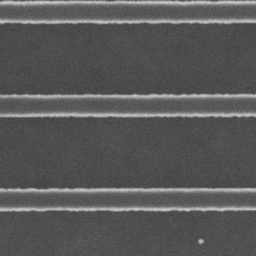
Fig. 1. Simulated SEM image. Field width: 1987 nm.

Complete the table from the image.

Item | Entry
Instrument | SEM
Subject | lines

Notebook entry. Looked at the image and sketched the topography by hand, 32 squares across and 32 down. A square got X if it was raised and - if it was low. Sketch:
XXXXXXXXXXXXXXXXXXXXXXXXXXXXXXXX
XXXXXXXXXXXXXXXXXXXXXXXXXXXXXXXX
XXXXXXXXXXXXXXXXXXXXXXXXXXXXXXXX
--------------------------------
--------------------------------
--------------------------------
--------------------------------
--------------------------------
--------------------------------
--------------------------------
--------------------------------
--------------------------------
XXXXXXXXXXXXXXXXXXXXXXXXXXXXXXXX
XXXXXXXXXXXXXXXXXXXXXXXXXXXXXXXX
XXXXXX-X-XXXXXXXXXXXXX-XXXXXX-X-
--------------------------------
--------------------------------
--------------------------------
--------------------------------
--------------------------------
--------------------------------
--------------------------------
--------------------------------
--------------------------------
XXXXXXXXXXXXXXXXXXXXXXXXXXXXXXXX
XXXXXXXXXXXXXXXXXXXXXXXXXXXXXXXX
--------------------------------
--------------------------------
--------------------------------
--------------------------------
--------------------------------
--------------------------------